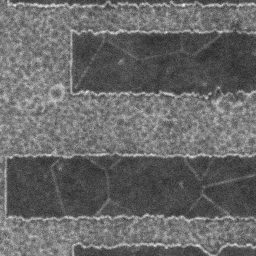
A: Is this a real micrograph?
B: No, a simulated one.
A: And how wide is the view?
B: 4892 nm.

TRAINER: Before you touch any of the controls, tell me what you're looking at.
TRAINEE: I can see one or a few lines or trenches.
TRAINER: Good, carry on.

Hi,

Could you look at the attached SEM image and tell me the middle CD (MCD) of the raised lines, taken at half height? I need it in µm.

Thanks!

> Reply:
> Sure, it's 1.2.